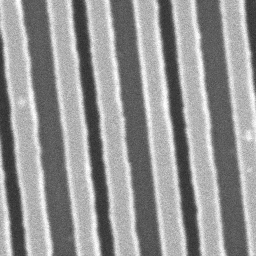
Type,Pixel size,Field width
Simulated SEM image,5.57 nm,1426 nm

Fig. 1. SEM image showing lines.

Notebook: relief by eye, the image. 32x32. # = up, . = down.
###...###..###...###..##....###.
###...###..###...###..##....###.
###...###..###...###..###...###.
###...###..###...###..###...###.
###...###..###...###..###...###.
###....##..###...###..###...###.
.##....###.###...###..###...###.
.###...###..##....##..###...###.
.###...###..###...##..###....##.
.###...###..###...###..##....##.
.###...###..###...###..##....###
.###...###..###...###..###...###
.###...###..###...###..###...###
.###....##..###...###..###...###
.####...###..##...###..###...###
.####...###..##....##..###...###
..###...###..###...###.###...###
..###...###..###...###..##....##
..###...###..###...###..##....##
..###...###..###...###..###...##
..###...###..###...###..###...##
..###...###..###...###..###...##
..###....##..###...###..###...##
#..##....###..##...###..###...##
#..###...###..###..###..###...##
#..###...###..###...##...##....#
#..###...###..###...###..##....#
#..###...###..###...###..###...#
#..###...###..###...###..###...#
#..###...###..###...###..###...#
#..###....##..###...###..###...#
#..###....##..###...###..###...#